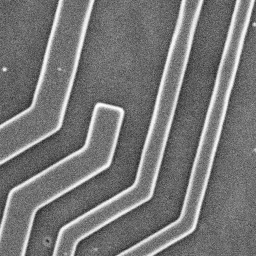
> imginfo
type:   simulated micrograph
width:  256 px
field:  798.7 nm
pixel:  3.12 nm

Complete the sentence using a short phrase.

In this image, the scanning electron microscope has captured groups of lines, slits or small figures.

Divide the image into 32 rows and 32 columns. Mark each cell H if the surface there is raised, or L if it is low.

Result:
LLLLLLLHHHHHLLLLLLLLLLLHHLLLLLHH
LLLLLLLHHHHLLLLLLLLLLLLHHLLLLHHL
LLLLLLLHHHHLLLLLLLLLLLHHHLLLLHHL
LLLLLLLHHHHLLLLLLLLLLLHHLLLLLHHL
LLLLLLHHHHLLLLLLLLLLLLHHLLLLLHHL
LLLLLLHHHHLLLLLLLLLLLLHHLLLLHHLL
LLLLLLHHHHLLLLLLLLLLLHHHLLLLHHLL
LLLLLLHHHHLLLLLLLLLLLHHLLLLLHHLL
LLLLLHHHHHLLLLLLLLLLLHHLLLLHHHLL
LLLLLHHHHLLLLLLLLLLLHHHLLLLHHLLL
LLLLLHHHHLLLLLLLLLLLHHHLLLLHHLLL
LLLLHHHHHLLLLLLLLLLLHHLLLLLHHLLL
LLLLHHHHLLLLLLLLLLLLHHLLLLHHLLLL
LLLLHHHHLLLLHHHLLLLHHHLLLLHHLLLL
LLHHHHHHLLLLHHHLLLLHHHLLLLHHLLLL
HHHHHHHHLLLHHHHLLLLHHLLLLLHHLLLL
HHHHHHHLLLLHHHHLLLLHHLLLLHHLLLLL
HHHHHLLLLLLHHHHLLLHHHLLLLHHLLLLL
HHHLLLLLLLHHHHLLLLHHHLLLLHHLLLLL
HHLLLLLLLHHHHHLLLLHHLLLLLHHLLLLL
LLLLLLLHHHHHHHLLLHHHLLLLHHLLLLLL
LLLLLHHHHHHHLLLLLHHHLLLLHHLLLLLL
LLLLHHHHHHHLLLLLLHHLLLLLHHLLLLLL
LLHHHHHHHLLLLLLLHHHLLLLHHHLLLLLL
LHHHHHHLLLLLLLLHHHHLLLLHHLLLLLLL
LHHHHHLLLLLLLHHHHHLLLLLHHLLLLLLL
LHHHHLLLLLLHHHHHLLLLLLLHHLLLLLLL
HHHHLLLLLHHHHHLLLLLLLLHHHLLLLLLL
HHHHLLLLHHHHLLLLLLLLLHHHLLLLLLLL
HHHHLLLHHHHLLLLLLLLHHHHLLLLLLLLL
HHHLLLLHHHLLLLLLLHHHHLLLLLLLLLLL
HHHLLLLHHLLLLLLHHHHHLLLLLLLLLLLL